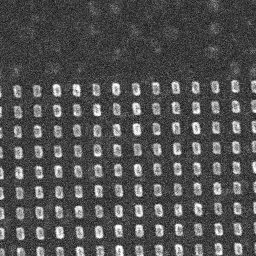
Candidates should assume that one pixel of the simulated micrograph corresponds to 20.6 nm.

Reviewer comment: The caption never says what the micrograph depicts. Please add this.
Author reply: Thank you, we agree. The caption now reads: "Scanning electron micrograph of a regular array of raised bodies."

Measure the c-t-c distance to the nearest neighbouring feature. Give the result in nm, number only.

402